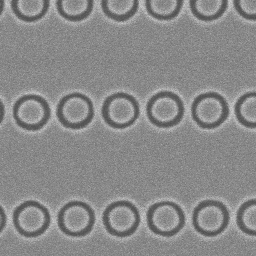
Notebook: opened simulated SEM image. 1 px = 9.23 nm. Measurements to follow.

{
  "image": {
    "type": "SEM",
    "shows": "a regular array of ring-shaped grooves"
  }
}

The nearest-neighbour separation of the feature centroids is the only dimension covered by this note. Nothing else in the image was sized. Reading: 0.413 micrometres